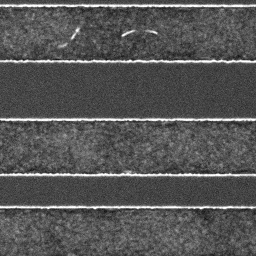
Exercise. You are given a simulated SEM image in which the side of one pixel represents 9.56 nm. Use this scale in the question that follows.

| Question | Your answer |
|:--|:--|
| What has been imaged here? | lines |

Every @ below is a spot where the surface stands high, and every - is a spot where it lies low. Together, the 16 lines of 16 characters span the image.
----------------
----------------
----------------
----------------
@@@@@@@@@@@@@@@@
@@@@@@@@@@@@@@@@
@@@@@@@@@@@@@@@@
@@@@@@@@@@@@@@@@
----------------
----------------
----------------
@@@@@@@@@@@@@@@@
@@@@@@@@@@@@@@@@
----------------
----------------
----------------